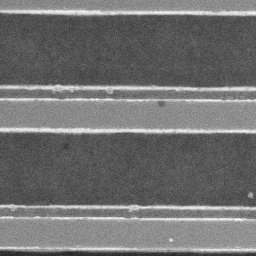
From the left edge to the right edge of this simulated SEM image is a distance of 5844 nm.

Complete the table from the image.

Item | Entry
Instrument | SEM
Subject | lines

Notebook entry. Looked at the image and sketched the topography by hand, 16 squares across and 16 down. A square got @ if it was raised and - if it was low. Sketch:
@@@@@@@@@@@@@@@@
----------------
----------------
----------------
----------------
---@@-----------
@@@@@@@@@@@@@@@@
@@@@@@@@@@@@@@@@
----------------
----------------
----------------
----------------
----------------
@@@@@@@@@@@@@@@@
@@@@@@@@@@@@@@@@
@@@@@@@@@@@@@@@@